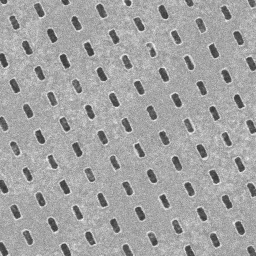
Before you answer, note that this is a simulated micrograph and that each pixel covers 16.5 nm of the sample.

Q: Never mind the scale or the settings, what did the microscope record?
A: a regular array of holes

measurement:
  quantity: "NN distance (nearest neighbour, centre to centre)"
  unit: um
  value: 0.454